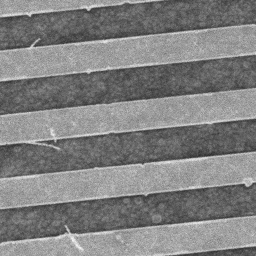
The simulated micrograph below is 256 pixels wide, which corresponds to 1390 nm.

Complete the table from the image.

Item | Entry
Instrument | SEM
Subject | one or a few lines or trenches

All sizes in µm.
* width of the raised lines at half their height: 0.158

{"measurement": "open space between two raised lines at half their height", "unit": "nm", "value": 187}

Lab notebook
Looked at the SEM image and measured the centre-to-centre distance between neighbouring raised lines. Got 345 nanometers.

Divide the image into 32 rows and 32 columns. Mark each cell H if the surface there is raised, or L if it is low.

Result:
HHHHHHHHHHHHHHHLLLLLLLLLLLLLLLLL
HHHHHLLLLLLLLLLLLLLLLLLLLLLLLLLL
LLLLLLLLLLLLLLLLLLLLLLLLLLLLLLLL
LLLLLLLLLLLLLLLLLLLLLLLLLLLLHHHH
LLLLLLLLLLLLLLLLLLHHHHHHHHHHHHHH
LLLLLLLLLHHHHHHHHHHHHHHHHHHHHHHH
HHHHHHHHHHHHHHHHHHHHHHHHHHHHHHHH
HHHHHHHHHHHHHHHHHHHHHHHHLLLLLLLL
HHHHHHHHHHHHHHHLLLLLLLLLLLLLLLLL
HHHHHLLLLLLLLLLLLLLLLLLLLLLLLLLL
LLLLLLLLLLLLLLLLLLLLLLLLLLLLLLLL
LLLLLLLLLLLLLLLLLLLLLLLLLLLLHHHH
LLLLLLLLLLLLLLLLLLHHHHHHHHHHHHHH
LLLLLLLLLHHHHHHHHHHHHHHHHHHHHHHH
HHHHHHHHHHHHHHHHHHHHHHHHHHHHHHHH
HHHHHHHHHHHHHHHHHHHHHHHHLLLLLLLL
HHHHHHHHHHHHHHLLLLLLLLLLLLLLLLLL
HHHHHLLLLLLLLLLLLLLLLLLLLLLLLLLL
LLLLLLLLLLLLLLLLLLLLLLLLLLLLLLLL
LLLLLLLLLLLLLLLLLLLLLLLLLLLLHHHH
LLLLLLLLLLLLLLLLLLHHHHHHHHHHHHHH
LLLLLLLLLHHHHHHHHHHHHHHHHHHHHHHH
HHHHHHHHHHHHHHHHHHHHHHHHHHHHHHHH
HHHHHHHHHHHHHHHHHHHHHHHHLLLLLLLL
HHHHHHHHHHHHHHHLLLLLLLLLLLLLLLLL
HHHHHLLLLLLLLLLLLLLLLLLLLLLLLLLL
LLLLLLLLLLLLLLLLLLLLLLLLLLLLLLLL
LLLLLLLLLLLLLLLLLLLLLLLLLLLLHHHH
LLLLLLLLLLLLLLLLLLHHHHHHHHHHHHHH
LLLLLLLHHHHHHHHHHHHHHHHHHHHHHHHH
HHHHHHHHHHHHHHHHHHHHHHHHHHHHHHHH
HHHHHHHHHHHHHHHHHHHHHHHHHLLLLLLL